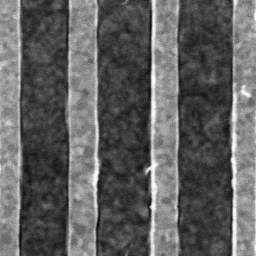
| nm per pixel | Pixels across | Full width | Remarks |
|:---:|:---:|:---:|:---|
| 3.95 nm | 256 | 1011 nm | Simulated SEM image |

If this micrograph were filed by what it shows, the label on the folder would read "one or a few lines or trenches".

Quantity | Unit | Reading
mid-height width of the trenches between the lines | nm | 216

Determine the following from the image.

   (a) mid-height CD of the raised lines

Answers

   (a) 0.105 um